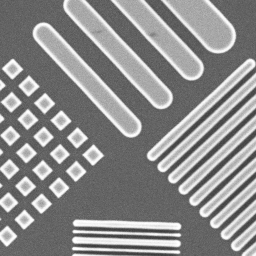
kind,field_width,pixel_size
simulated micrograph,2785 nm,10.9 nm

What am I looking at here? groups of lines, slits or small figures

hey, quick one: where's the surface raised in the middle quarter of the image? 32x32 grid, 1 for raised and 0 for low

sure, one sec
11111100000001111111100000001111
11111110000000111111100000001111
01111111000000011111110000000111
00111111100000001111111000000001
00011111110000000111111100000000
00001111111000000011111110000000
00000111111000000001111111000000
00000011111100000000111111100000
00000001111110000000011111100000
00000001111111000000001111100000
00000000011111100000000111000000
00000000011111110000000000000000
00000000001111111000000000000000
10000000000111111100000000000001
10000000000011111110000000000011
00000000000001111110000000001111
00010000000000111110000000011110
00111000000000011100000000111000
01111000000000000000000001110001
00111000000000000000000011110011
00000000000000000000000111001111
00000011000000000000001110001110
10000111100000000000011100111100
00000011100000000000011001111001
00000001000000000000000011110011
00110000000000000000000011000111
01111000000000000000000011001110
01111000000000000000000000011100
00110000000000000000000000111001
00000000000000000000000000000011
10000000000000000000000000000111
10000000000000000000000000000110